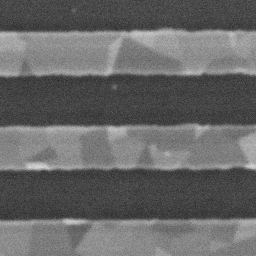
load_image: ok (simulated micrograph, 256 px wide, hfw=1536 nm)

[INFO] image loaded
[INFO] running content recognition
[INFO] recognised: lines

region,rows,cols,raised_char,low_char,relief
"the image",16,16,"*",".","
................
................
****************
****************
****************
................
................
................
****************
****************
**************..
................
................
................
****************
****************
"